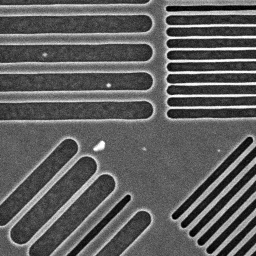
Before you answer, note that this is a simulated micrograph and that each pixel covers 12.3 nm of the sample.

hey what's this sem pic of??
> groups of lines, slits or small figures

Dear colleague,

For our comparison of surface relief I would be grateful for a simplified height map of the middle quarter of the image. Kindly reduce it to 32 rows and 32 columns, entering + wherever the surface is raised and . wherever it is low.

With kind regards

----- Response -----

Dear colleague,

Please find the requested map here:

++++++++++++++++++++++++++......
++++++++++++++++++++++++++......
.....................++++++.....
......................++++......
......................++++......
......................++++......
....................++++++......
++++++++++++++++++++++++++......
++++++++++++++++++++++++++......
.....................+++++......
......................++++......
......................++++......
......................++++......
.....................+++++......
++++++++++++++++++++++++++++++++
++++++++++++++++++++++++++++++++
++++++++++++++++++++++++++++++++
++++++++++++++++++++++++++++++++
++++++++++++++++++++++++++++++++
...+++++++++++++++++++++++++++++
....++++++++++++++++++++++++++++
....++++++++++++++++++++++++++++
...+++++++++++++++++++++++++++++
..++...+++++++++++++++++++++++++
.++.....++++++++++++++++++++++++
++......++++++++++++++++++++++++
+.......++++++++++++++++++++++++
........++.+++++++++++++++++++++
.......+....++++++++++++++++++++
......+......+++++++++++++++++++
.....+.......+++++++++++++++++++
....+........+++++++++++++++++++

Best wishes